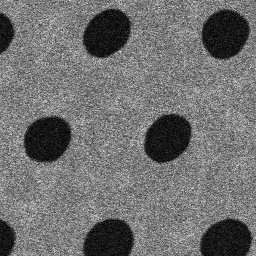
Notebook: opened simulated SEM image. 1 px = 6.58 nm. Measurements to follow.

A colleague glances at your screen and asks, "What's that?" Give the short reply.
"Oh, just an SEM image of holes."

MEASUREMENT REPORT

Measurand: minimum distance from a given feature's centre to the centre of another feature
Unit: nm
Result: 780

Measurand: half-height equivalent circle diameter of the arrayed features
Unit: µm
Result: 0.309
